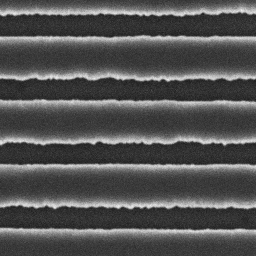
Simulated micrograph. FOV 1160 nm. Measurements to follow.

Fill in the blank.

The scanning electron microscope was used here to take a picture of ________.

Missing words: lines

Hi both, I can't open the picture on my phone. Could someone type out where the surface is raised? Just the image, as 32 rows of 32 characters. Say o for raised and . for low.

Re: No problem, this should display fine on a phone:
oooooooooooooooooooooooooooooooo
oooooooooooooooooooooooooooooooo
................................
................................
................................
oooooooooooooooooooooooooooooooo
oooooooooooooooooooooooooooooooo
oooooooooooooooooooooooooooooooo
oooooooooooooooooooooooooooooooo
oooooooooooooooooooooooooooooooo
................................
................................
................................
oooooooooooooooooooooooooooooooo
oooooooooooooooooooooooooooooooo
oooooooooooooooooooooooooooooooo
oooooooooooooooooooooooooooooooo
oooooooooooooooooooooooooooooooo
................................
................................
................................
oooooooooooooooooooooooooooooooo
oooooooooooooooooooooooooooooooo
oooooooooooooooooooooooooooooooo
oooooooooooooooooooooooooooooooo
oooooooooooooooooooooooooooooooo
................................
................................
................................
oooooooooooooooooooooooooooooooo
oooooooooooooooooooooooooooooooo
oooooooooooooooooooooooooooooooo